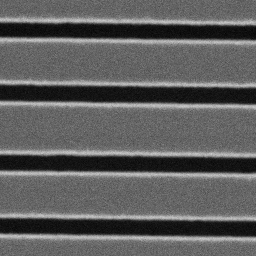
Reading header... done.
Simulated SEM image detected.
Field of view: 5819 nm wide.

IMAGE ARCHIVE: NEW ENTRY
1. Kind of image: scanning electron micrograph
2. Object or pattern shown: lines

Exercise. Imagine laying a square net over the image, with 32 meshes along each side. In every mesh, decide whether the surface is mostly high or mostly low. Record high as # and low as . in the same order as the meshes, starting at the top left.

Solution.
################################
################################
################################
................................
................................
################################
################################
################################
################################
################################
################################
................................
................................
################################
################################
################################
################################
################################
################################
...................#############
................................
################................
################################
################################
################################
################################
################################
.............................#.#
................................
###############.................
################################
################################